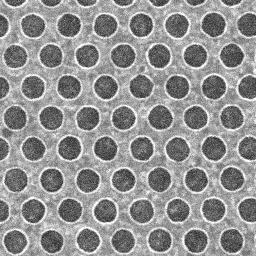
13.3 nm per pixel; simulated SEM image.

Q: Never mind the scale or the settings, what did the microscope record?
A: a regular array of holes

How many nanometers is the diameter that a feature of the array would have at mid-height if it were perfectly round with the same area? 327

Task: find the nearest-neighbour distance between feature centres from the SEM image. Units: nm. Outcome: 469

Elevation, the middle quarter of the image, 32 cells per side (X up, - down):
XXXX----XXXXX----XXXXX----XXXXX-
XXXXXXXXXXXXXXXXXXXXXXXXXXXXXXXX
XXXXXXXXXXXXXXXXXXXXXXXXXXXXXXXX
---XXXXX----XXXXX----XXXXX-----X
----XXXX-----XXX------XXX------X
----XXX-------XX------XXX-------
----XXXX------XX------XXX------X
----XXXX-----XXXX-----XXXX-----X
---XXXXXX---XXXXXX---XXXXXX---XX
XXXXXXXXXXXXXXXXXXXXXXXXXXXXXXXX
XXXXXXXXXXXXXX--XXXXXX---XXXXXXX
XXXX----XXXX-----XXXXX----XXXX--
XXX------XXX------XXX------XXX--
XXX------XXX------XXX------XXX--
XXX------XXX------XXX------XXX--
XXX-----XXXX-----XXXXX-----XXXX-
XXXXX--XXXXXXX--XXXXXXX--XXXXXXX
XXXXXXXXXXXXXXXXXXXXXXXXXXXXXXXX
----XXXXX---XXXXXX---XXXXXX---XX
----XXXX-----XXXX-----XXXX-----X
-----XX------XXX-------XX------X
-----XX-------XXX------XX-------
----XXXX-----XXXX-----XXXX-----X
----XXXX-----XXXX-----XXXX-----X
XXXXXXXXXX-XXXXXXXXXXXXXXXXX-XXX
XXXXXXXXXXXXXXXXXXXXXXXXXXXXXXXX
XXXX---XXXXXX----XXXXX----XXXXX-
XXX------XXX-----XXXX-----XXXX--
XXX------XXX------XXX------XXX--
XXX------XXX------XXX------XXX--
XXX------XXX------XXX------XXX--
XXXX----XXXXX----XXXXX----XXXXX-